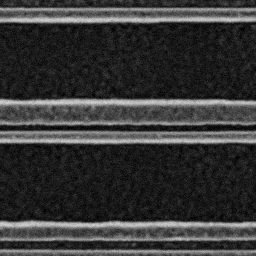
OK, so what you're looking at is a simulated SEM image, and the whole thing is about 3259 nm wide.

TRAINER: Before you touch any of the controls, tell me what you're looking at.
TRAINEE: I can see lines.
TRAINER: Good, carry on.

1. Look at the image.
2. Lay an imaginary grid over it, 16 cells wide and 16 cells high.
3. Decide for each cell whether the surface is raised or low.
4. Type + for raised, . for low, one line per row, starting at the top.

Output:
++++++++++++++++
................
................
................
................
................
++++++++++++++++
++++++++++++++++
++++++++++++++++
................
................
................
................
................
++++++++++++++++
++++++++++++++++